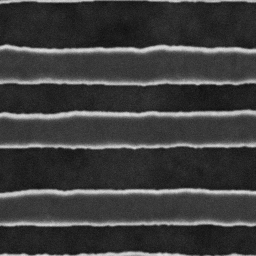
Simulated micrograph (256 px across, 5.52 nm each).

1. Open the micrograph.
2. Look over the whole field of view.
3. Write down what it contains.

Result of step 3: lines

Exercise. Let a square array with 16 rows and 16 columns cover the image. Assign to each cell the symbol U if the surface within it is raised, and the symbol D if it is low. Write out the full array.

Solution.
DDDDDDDDDDDDDDDD
DDDDDDDDDDDDDDDD
DDDDDDDDDDDDDDDD
UUUUUUUUUUUUUUUU
UUUUUUUUUUUUUUUU
DDDDDDDDDDDDDDDD
DDDDDDDDDDDDDDDD
UUUUUUUUUUUUUUUU
UUUUUUUUUUUUUUUU
DDDDDDDDDDDDDDDD
DDDDDDDDDDDDDDDD
DDDDDDDDDDDDDDDD
UUUUUUUUUUUUUUUU
UUUUUUUUUUUUUUUU
DDDDDDDDDDDDDDDD
DDDDDDDDDDDDDDDD